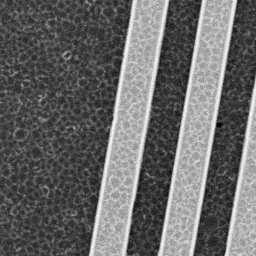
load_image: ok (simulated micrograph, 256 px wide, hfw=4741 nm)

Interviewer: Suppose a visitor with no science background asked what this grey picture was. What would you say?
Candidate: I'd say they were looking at one or a few lines or trenches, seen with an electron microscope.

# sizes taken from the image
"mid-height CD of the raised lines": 564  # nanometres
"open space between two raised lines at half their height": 675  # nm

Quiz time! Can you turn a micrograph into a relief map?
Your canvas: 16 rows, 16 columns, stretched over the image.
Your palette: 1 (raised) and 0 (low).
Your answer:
0000000011000110
0000000011001100
0000000011001100
0000000011001100
0000000011001100
0000000010001100
0000000110001100
0000000110011000
0000000110011001
0000000110011001
0000000110011001
0000001100011001
0000001100011001
0000001100110001
0000001100110011
0000001100110011